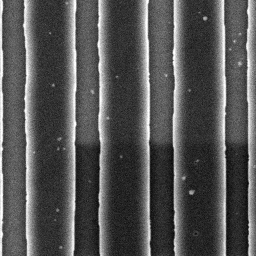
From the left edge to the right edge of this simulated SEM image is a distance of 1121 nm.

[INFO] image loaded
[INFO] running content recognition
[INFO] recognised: lines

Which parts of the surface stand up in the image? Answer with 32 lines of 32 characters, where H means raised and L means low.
LLLHHHHHHLLLHHHHHHHLLLHHHHHHLLLH
LLLHHHHHHLLLHHHHHHLLLLHHHHHHLLLH
LLLHHHHHHLLLHHHHHHLLLLHHHHHHLLLH
LLLHHHHHHLLLHHHHHHLLLLHHHHHHLLLH
LLLHHHHHHLLLHHHHHHLLLLHHHHHHLLLH
LLLHHHHHHLLLHHHHHHHLLLHHHHHHLLLH
LLLHHHHHHLLLHHHHHHHLLLHHHHHHLLLH
LLLHHHHHHLLLHHHHHHHLLLHHHHHHLLLH
LLLHHHHHHLLLHHHHHHHLLLHHHHHHLLLH
LLLHHHHHHLLLLHHHHHHLLLHHHHHHLLLH
LLLHHHHHHLLLLHHHHHHLLLHHHHHHLLLH
LLLHHHHHHLLLLHHHHHHLLLHHHHHHLLLH
LLLHHHHHHLLLLHHHHHHLLLHHHHHHLLLH
LLLHHHHHHLLLLHHHHHHLLLHHHHHHLLLH
LLLHHHHHHLLLHHHHHHHLLLHHHHHHLLLH
LLLHHHHHHLLLHHHHHHHLLLHHHHHHLLLH
LLLHHHHHHLLLHHHHHHHLLLHHHHHHLLLH
LLLHHHHHHLLLLHHHHHHLLLHHHHHHLLLH
LLLHHHHHHLLLLHHHHHHLLLHHHHHHLLLH
LLLHHHHHHLLLLHHHHHHLLLHHHHHHLLLH
LLLHHHHHHLLLLHHHHHHLLLHHHHHHLLLH
LLLHHHHHHLLLLHHHHHHLLLHHHHHHLLLH
LLLHHHHHHLLLLHHHHHHLLLHHHHHHLLLH
LLLHHHHHHLLLLHHHHHHLLLHHHHHHLLLH
LLLHHHHHHLLLHHHHHHHLLLHHHHHHLLLH
LLLHHHHHHLLLHHHHHHHLLLHHHHHHLLLH
LLLHHHHHHLLLHHHHHHHLLLHHHHHHLLLH
LLLHHHHHHLLLHHHHHHHLLLHHHHHHLLLH
LLLHHHHHHLLLHHHHHHHLLLHHHHHHLLLH
LLLHHHHHHLLLLHHHHHHLLLHHHHHHLLLH
LLLHHHHHHLLLLHHHHHHLLLHHHHHHLLLH
LLLHHHHHHLLLLHHHHHHLLLHHHHHHLLLH